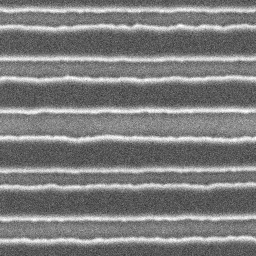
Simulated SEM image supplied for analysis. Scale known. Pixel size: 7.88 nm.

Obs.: lines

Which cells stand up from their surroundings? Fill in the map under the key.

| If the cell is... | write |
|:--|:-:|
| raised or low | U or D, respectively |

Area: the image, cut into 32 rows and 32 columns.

UUUUUUUUUUUUUUUUUUUUUUUUUUUUUUUU
DDDDDDDDDDDDDDDDDDDDDDDDDDDDDDDD
DDDDDDDDDDDDDDDDDDDDDDDDDDDDDDDD
UUUUUUUUUUUUUUUUUUUUUUUUUUUUUUUU
UUUUUUUUUUUUUUUUUUUUUUUUUUUUUUUU
UUUUUUUUUUUUUUUUUUUUUUUUUUUUUUUU
UUUUUUUUUUUUUUUUUUUUUUUUUUUUUUUU
DDDDUDDDDDDDUUUUUUUUUDUDDDUUUDDD
DDDDDDDDDDDDDDDDDDDDDDDDDDDDDDDD
DDDDDDDDDDDDDDDDDDDDDDDDDDDDDDDD
UUUUUUUUUUUUUUUUUUUUUUUUUUUUUUUU
UUUUUUUUUUUUUUUUUUUUUUUUUUUUUUUU
UUUUUUUUUUUUUUUUUUUUUUUUUUUUUUUU
UUUUUUUUUUUUUUUUUUUUUUUUUUUUUUUU
DDDDDDDDDDDDDDDDDDDDDDDDDDDDDDDD
DDDDDDDDDDDDDDDDDDDDDDDDDDDDDDDD
DDDDDDDDDDDDDDDDDDDDDDDDDDDDDDDD
UUUUUUUUUUUUUUUUUUUUUUUUUUUUUUUU
UUUUUUUUUUUUUUUUUUUUUUUUUUUUUUUU
UUUUUUUUUUUUUUUUUUUUUUUUUUUUUUUU
UUUUUUUUUUUUUUUUUUUUUUUUUUUUUUUU
UUDDDDDDUUDDUDDDDDDDDDDDDDDDDDDD
DDDDDDDDDDDDDDDDDDDDDDDDDDDDDDDD
UUUUUUUUUUUUUUUUUUUUUUUUUUUUUUUU
UUUUUUUUUUUUUUUUUUUUUUUUUUUUUUUU
UUUUUUUUUUUUUUUUUUUUUUUUUUUUUUUU
UUUUUUUUUUUUUUUUUUUUUUUUUUUUUUUU
UUDDUDUUDDDDDDDUDDDDDDDDDDDDDDDD
DDDDDDDDDDDDDDDDDDDDDDDDDDDDDDDD
DDDDDDDDDDDDDDDDDDDDDDDDDDDDDDDD
UUUUUUUUUUUUUUUUUUUUUUUUUUUUUUUU
UUUUUUUUUUUUUUUUUUUUUUUUUUUUUUUU